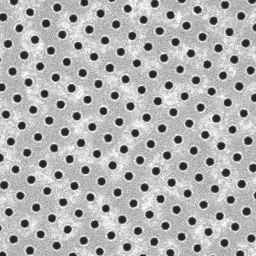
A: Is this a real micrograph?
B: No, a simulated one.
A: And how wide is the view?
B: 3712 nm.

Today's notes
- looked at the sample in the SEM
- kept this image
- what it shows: a regular array of holes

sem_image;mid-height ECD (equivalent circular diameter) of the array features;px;8.06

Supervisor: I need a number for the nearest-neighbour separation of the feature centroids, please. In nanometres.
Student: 278